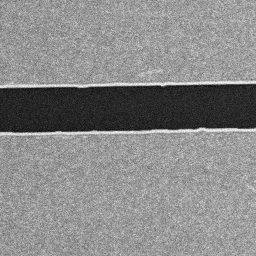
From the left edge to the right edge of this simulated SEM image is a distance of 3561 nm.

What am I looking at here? one or a few lines or trenches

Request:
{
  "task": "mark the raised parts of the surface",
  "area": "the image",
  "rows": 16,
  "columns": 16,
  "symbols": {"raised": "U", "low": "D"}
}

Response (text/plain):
UUUUUUUUUUUUUUUU
UUUUUUUUUUUUUUUU
UUUUUUUUUUUUUUUU
UUUUUUUUUUUUUUUU
UUUUUUUUUUUUUUUU
DDDDDDDDDDDDDDDD
DDDDDDDDDDDDDDDD
DDDDDDDDDDDDDDDD
UUUUUUUUUUUUUUUU
UUUUUUUUUUUUUUUU
UUUUUUUUUUUUUUUU
UUUUUUUUUUUUUUUU
UUUUUUUUUUUUUUUU
UUUUUUUUUUUUUUUU
UUUUUUUUUUUUUUUU
UUUUUUUUUUUUUUUU